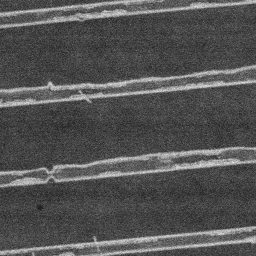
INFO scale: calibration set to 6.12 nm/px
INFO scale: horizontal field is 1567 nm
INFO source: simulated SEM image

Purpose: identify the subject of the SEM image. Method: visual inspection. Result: one or a few lines or trenches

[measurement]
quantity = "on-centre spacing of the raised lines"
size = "0.484 micrometres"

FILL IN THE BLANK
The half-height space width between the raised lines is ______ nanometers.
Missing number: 403